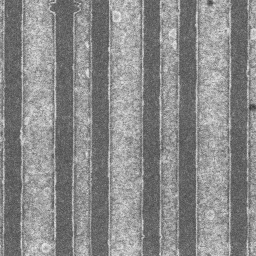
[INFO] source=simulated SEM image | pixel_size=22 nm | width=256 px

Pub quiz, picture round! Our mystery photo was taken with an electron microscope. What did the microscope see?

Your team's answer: parallel lines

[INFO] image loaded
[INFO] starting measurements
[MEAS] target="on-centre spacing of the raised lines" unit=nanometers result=994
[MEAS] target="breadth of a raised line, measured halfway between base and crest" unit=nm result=404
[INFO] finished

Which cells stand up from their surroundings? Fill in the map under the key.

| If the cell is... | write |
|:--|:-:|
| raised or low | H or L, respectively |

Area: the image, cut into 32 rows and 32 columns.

LHHLLLHHHHLHHHLLLLHHLLHHHLLLLHHL
LHHLLLHHHHLHHHLLLLHHLLHHHLLLLHHL
LHHLLLLHHLLHHHLLLLHHLLHHHLLLLHHL
LHHLLLLHHLLHHHLLLLHHLLHHHLLLLHHL
LHHLLLLHHLLHHHLLLLHHLLHHHLLLLHHL
LHHLLLLHHLLHHHLLLLHHLLHHHLLLLHHL
LHHLLLLHHLLHHHLLLLHHLLHHHLLLLHHL
LHHLLLLHHLLHHHLLLLHHLLHHHLLLLHHL
LHHLLLLHHLLHHHLLLLHHLLHHHLLLLHHL
LHHLLLLHHLLHHHLLLLHHLLHHHLLLLHHL
LHHLLLLHHLLHHHLLLLHHLLHHHLLLLHHL
LHHLLLLHHLLHHHLLLLHHLLHHHLLLLHHL
LHHLLLLHHLLHHHLLLLHHLLHHHLLLLHHL
LHHLLLLHHLLHHHLLLLHHLLHHHLLLLHHL
LHHLLLLHHLLHHHLLLLHHLLHHHLLLLHHL
LHHLLLLHHLLHHHLLLLHHLLHHHLLLLHHL
HHHLLLLHHLLHHHLLLLHHLLHHHLLLLHHL
HHHLLLLHHLLHHHLLLLHHLLHHHLLLLHHL
HHHLLLLHHLLHHHLLLLHHLLHHHLLLLHHL
HHHLLLLHHLLHHHLLLLHHLLHHHLLLLHHL
HHHLLLLHHLLHHHLLLLHHLLHHHLLLLHHL
HHHLLLLHHLLHHHLLLLHHLLHHHLLLLHHL
HHHLLLLHHLLHHHLLLLHHLLHHLLLLLHHL
HHHLLLLHHLLHHHLLLLHHLLHHLLLLLHHL
HHHLLLLHHLLHHHLLLLHHLLHHLLLLLHHL
HHHLLLLHHLLHHHLLLLHHLLHHLLLLLHHL
HHHLLLLHHLLHHHLLLLHHLLHHLLLLLHHL
HHHLLLLHHLLHHHLLLLHHLLHHLLLLLHHL
HHHLLLLHHLLHHHLLLLHHLLHHHLLLLHHL
HHHLLLLHHLLHHHLLLLHHLLHHLLLLLHHL
HHHLLLLHHLLHHHLLLLHHLLHHLLLLLHHL
HHHLLLLHHLLHHHLLLLHHLLHHHLLLLHHL